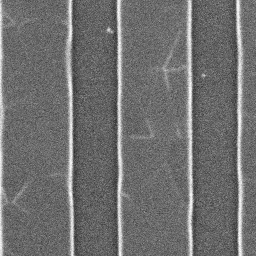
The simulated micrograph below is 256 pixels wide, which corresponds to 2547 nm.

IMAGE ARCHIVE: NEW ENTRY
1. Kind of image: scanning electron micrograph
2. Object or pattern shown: wiring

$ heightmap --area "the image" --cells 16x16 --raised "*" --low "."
****...*****...*
****...*****...*
****...*****...*
****...*****...*
****...*****...*
****...*****...*
****...*****...*
****...*****...*
****...*****...*
****...*****...*
****...*****...*
****...*****...*
****...*****...*
*****..*****...*
*****..*****...*
*****..*****...*